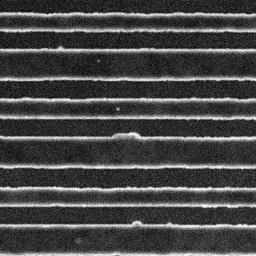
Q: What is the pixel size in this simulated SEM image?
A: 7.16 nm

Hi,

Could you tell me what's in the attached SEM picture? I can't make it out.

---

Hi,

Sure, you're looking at lines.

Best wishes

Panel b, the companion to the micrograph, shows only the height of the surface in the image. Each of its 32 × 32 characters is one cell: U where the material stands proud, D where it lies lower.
DDDDDDDDDDDDDDDDDDDDDDDDDDDDDDDD
DDDDDDDDDDDDDDDDDDDDDDDDDDDDDDDD
UUUUUUUUUUUUUUUUUUUUUUUUUUUUUUUU
UUUUUUUUUUUUUUUUUUUUUUUUUUUUUUUU
DDDDDDDDDDDDDDDDDDDDDDDDDDDDDDDD
DDDDDDDDDDDDDDDDDDDDDDDDDDDDDDDD
UUUUUUUUUUUUUUUUUUUUUUUUUUUUUUUU
UUUUUUUUUUUUUUUUUUUUUUUUUUUUUUUU
UUUUUUUUUUUUUUUUUUUUUUUUUUUUUUUU
UUUUUUUUUUUUUUUUUUUUUUUUUUUUUUUU
DDDDDDDDDDDDDDDDDDDDDDDDDDDDDDDD
DDDDDDDDDDDDDDDDDDDDDDDDDDDDDDDD
UUUUUUUUUDUUUUUUUUUUUUUUUUUUUUDU
UUUUUUUUUUUUUUUUUUUUUUUUUUUUUUUU
UUUUUUUUUUUUUUUUUUUUUUUUUUUUUUUU
DDDDDDDDDDDDDDDDDDDDDDDDDDDDDDDD
DDDDDDDDDDDDDDDDDDDDDDDDDDDDDDDD
UUUUUUUUUUUUUUUUUUUUUUUUUUUUUUUU
UUUUUUUUUUUUUUUUUUUUUUUUUUUUUUUU
UUUUUUUUUUUUUUUUUUUUUUUUUUUUUUUU
UUUUUUUUUUUUUUUUUUUUUUUUUUUUUUUU
DDDDDDDDDDDDDDDDDDDDDDDDDDDDDDDD
DDDDDDDDDDDDDDDDDDDDDDDDDDDDDDDD
UUUUUUUUDDDUDDDUUUUUUUUUDDUDUDUD
UUUUUUUUUUUUUUUUUUUUUUUUUUUUUUUU
UUUUUUUUUUUUUUUUUUUUUUUUUUUUUUUU
DDDDDDDDDDDDDDDDDDDDDDDDDDDDDDDD
DDDDDDDDDDDDDDDDDDDDDDDDDDDDDDDD
UUUUUUUUUUUUUUUUUUUUUUUUUUUUUUUU
UUUUUUUUUUUUUUUUUUUUUUUUUUUUUUUU
UUUUUUUUUUUUUUUUUUUUUUUUUUUUUUUU
UUUUUUUUUUUUUUUUUUUUUUUUUUUUUUUU